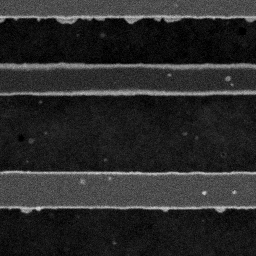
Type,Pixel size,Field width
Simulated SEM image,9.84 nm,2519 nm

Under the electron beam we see lines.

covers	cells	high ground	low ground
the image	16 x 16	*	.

****************
................
................
................
****************
****************
................
................
................
................
................
****************
****************
................
................
................